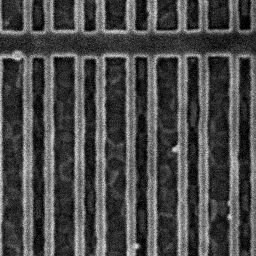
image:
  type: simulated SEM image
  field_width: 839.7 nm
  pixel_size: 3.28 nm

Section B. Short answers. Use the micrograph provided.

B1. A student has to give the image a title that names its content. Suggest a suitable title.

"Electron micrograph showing parallel lines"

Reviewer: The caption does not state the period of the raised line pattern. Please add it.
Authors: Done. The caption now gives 0.0847 microns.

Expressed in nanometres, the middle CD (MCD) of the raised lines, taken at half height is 25.8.